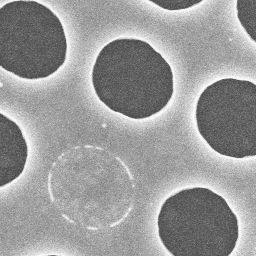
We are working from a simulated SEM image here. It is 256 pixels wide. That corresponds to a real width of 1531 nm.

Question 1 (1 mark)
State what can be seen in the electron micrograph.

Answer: holes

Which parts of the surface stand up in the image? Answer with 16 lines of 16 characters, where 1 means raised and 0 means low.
0001111111001110
0000111111111110
0000111001111111
0000110000111111
1001110000011111
1111110000011000
1111111000110000
0111111111110000
0111111111111000
0011111111111100
0111111111111111
1111111111111111
1111111111000011
1111111111000001
1111111111000001
1111111111000001